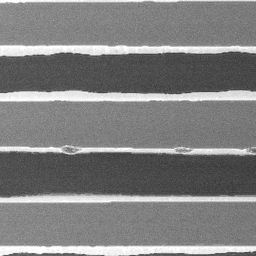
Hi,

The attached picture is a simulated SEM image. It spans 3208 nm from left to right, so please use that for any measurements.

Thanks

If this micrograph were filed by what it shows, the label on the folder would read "lines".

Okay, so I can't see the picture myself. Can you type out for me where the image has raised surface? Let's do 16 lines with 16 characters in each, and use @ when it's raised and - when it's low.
@@@@@@@@@@@@@@@@
@@@@@@@@@@@@@@@@
@@@@@@@@@@@@@@@@
----------------
----------------
----------------
@@@@@@@@@@@@@@@@
@@@@@@@@@@@@@@@@
@@@@@@@@@@@@@@@@
----@------@---@
----------------
----------------
--------@-----@-
@@@@@@@@@@@@@@@@
@@@@@@@@@@@@@@@@
@@@@@@@@@@@@@@@@